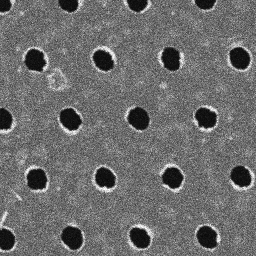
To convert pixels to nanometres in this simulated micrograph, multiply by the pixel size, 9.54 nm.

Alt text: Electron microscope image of a regular array of holes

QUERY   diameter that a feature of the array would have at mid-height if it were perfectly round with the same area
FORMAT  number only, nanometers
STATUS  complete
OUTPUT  208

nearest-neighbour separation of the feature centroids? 0.643 um